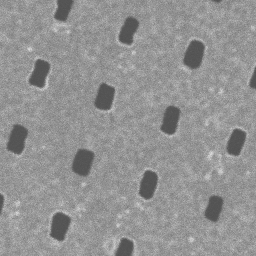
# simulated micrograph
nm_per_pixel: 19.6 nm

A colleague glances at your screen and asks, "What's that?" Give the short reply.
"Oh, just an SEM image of a regular array of holes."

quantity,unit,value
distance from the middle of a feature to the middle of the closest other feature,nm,1360